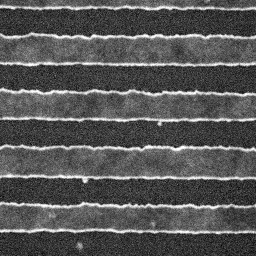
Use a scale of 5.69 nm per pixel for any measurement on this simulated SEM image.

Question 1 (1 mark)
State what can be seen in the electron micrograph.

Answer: lines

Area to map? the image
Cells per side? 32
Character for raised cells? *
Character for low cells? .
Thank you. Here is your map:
********************************
................................
................................
................................
**.****.**..****.********.***...
********************************
********************************
********************************
................................
................................
................................
*****.*********.**....*.*.......
********************************
********************************
********************************
................................
................................
................................
***************...************..
********************************
********************************
********************************
................................
................................
................................
**........*.....................
********************************
********************************
********************************
................................
................................
................................